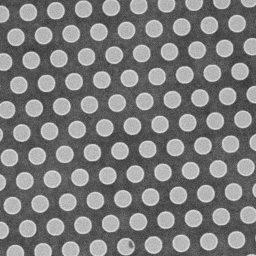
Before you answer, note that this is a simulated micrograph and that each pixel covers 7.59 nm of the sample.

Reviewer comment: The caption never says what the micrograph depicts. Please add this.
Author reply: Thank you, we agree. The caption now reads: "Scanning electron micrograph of an array of small figures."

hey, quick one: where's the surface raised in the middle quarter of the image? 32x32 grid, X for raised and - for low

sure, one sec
--------------------------------
----------------------XXX----XXX
--X-----XXX---XXXX---XXXX---XXXX
-XXX---XXXXX--XXXX---XXXX---XXXX
XXXXX--XXXXX---XXX----XXX----XX-
-XXX----XXX-----X---------------
--------------------------------
-------------------XX----XXXX---
-----XXX----XXX---XXXX---XXXX---
X---XXXX---XXXX---XXXX---XXXX---
X---XXXX---XXXX---XXXX----XX----
X----XXX----XXX-----------------
--------------------------------
-----------------X-----XX----XXX
--XX-----XXX---XXXX---XXXX---XXX
-XXXX---XXXX---XXXX---XXXX---XXX
-XXXX---XXXX---XXXX---XXXX----XX
-XXXX----XXX----XX--------------
--------------------------------
--------------------XX----XXX---
------XX----XXXX---XXXX---XXXX--
XX---XXXX---XXXX---XXXX---XXXX--
XX---XXXX---XXXX---XXXX----XX---
XX---XXXX----XX-----------------
X-------------------------------
------------------X----XXX----XX
---XX----XXX----XXXX---XXXX---XX
--XXXX---XXXX---XXXX---XXXX---XX
--XXXX---XXXX---XXXX---XXX-----X
--XXXX---XXX-----XX-------------
--------------------------------
---------------------XX----XXX--